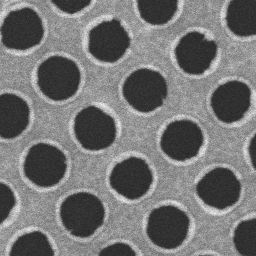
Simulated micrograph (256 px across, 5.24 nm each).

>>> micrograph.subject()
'a regular array of holes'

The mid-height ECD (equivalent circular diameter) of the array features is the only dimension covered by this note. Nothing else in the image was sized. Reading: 225 nanometers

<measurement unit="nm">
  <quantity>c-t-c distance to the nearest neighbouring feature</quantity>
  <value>319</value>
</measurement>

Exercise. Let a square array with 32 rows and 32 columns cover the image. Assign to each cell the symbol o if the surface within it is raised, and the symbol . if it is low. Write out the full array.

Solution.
ooooooo....oooooo.....ooooooo...
o...oooo..ooooooo.....oooooo....
.....ooooooooo.ooo...ooooooo....
.....ooooooo...oooooooooooooo...
.....oooooo.....ooooooo...oooo.o
.....oooooo.....oooooo.....ooooo
ooooooooooo.....oooooo.....ooooo
oooooo...ooo...ooooooo.....ooooo
ooooo.....ooooooooooooo...oooooo
ooooo.....oooooo....oooooooooooo
ooooo.....ooooo......ooooooo...o
ooooo.....ooooo......oooooo....o
...oooo.oooooooo.....ooooo.....o
....ooooooo.ooooo...oooooo.....o
....ooooo.....ooooooooooooo...oo
...oooooo.....ooooooo....ooooooo
...oooooo......ooooo.....ooooooo
oooooooooo....oooooo.....oooooo.
oooo...oooo..ooooooo.....oooooo.
ooo.....ooooooooooooo...ooooooo.
ooo.....ooooooo...ooooooooooooo.
ooo.....oooooo.....ooooooo...ooo
oooo....oooooo.....oooooo.....oo
.ooooooooooooo.....oooooo.....oo
..ooooooo...ooo...ooooooo.....oo
..oooooo.....ooooooooooooo...ooo
.oooooo......oooooo....ooooooooo
.ooooooo.....ooooo......ooooooo.
oooooooo....oooooo......ooooo...
ooo...ooo..ooooooo.....oooooo...
oo....oooooooo..ooo....oooooo...
o......oooooo....ooooooooooooo..